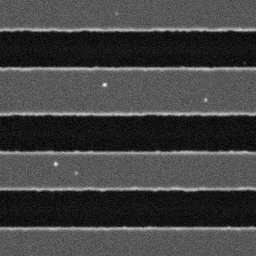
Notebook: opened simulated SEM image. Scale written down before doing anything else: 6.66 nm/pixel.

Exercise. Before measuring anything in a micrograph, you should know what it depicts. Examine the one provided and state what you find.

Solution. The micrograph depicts lines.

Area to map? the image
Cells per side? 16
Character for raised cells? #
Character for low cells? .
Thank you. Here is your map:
################
################
................
................
################
################
################
................
................
....##...#.#..##
################
################
................
................
################
################